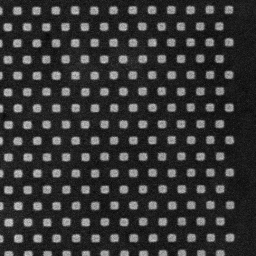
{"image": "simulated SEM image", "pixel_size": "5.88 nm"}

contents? a regular array of raised bodies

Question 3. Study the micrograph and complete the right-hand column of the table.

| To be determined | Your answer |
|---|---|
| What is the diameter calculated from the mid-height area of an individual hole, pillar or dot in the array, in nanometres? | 50.3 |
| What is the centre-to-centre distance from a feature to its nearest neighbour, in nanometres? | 109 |